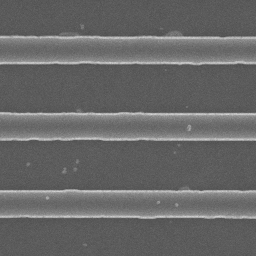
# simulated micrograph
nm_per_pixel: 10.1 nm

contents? lines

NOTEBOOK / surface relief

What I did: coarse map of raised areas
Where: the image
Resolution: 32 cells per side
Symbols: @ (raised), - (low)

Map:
--------------------------------
--------------------------------
--------------------------------
--------------------------------
--------------------------------
@@@@@@@@@@@@@@@@@@@@@@@@@@@@@@@@
@@@@@@@@@@@@@@@@@@@@@@@@@@@@@@@@
@@@@@@@@@@@@@@@@@@@@@@@@@@@@@@@@
--------------------------------
--------------------------------
--------------------------------
--------------------------------
--------------------------------
--------------------------------
@@@@@@@@@@@@@@@@@@@@@@@@@@@@@@@@
@@@@@@@@@@@@@@@@@@@@@@@@@@@@@@@@
@@@@@@@@@@@@@@@@@@@@@@@@@@@@@@@@
--------------------------------
--------------------------------
--------------------------------
--------------------------------
--------------------------------
--------------------------------
--------------------------------
@@@@@@@@@@@@@@@@@@@@@@@@@@@@@@@@
@@@@@@@@@@@@@@@@@@@@@@@@@@@@@@@@
@@@@@@@@@@@@@@@@@@@@@@@@@@@@@@@@
--------------------------------
--------------------------------
--------------------------------
--------------------------------
--------------------------------